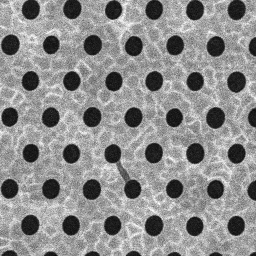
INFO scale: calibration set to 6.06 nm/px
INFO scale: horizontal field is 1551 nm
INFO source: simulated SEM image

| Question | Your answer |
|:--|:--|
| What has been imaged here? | a regular array of holes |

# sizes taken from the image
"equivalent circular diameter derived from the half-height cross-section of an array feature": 115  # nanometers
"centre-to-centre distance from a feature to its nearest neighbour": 0.248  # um